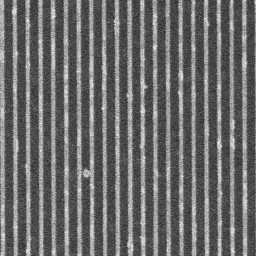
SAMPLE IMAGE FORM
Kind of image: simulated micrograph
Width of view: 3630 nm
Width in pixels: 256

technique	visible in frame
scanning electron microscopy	parallel lines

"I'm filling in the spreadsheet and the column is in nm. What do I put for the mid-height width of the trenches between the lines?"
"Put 140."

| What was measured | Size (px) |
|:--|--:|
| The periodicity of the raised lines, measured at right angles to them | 12.7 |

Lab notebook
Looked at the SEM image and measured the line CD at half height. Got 0.0496 um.